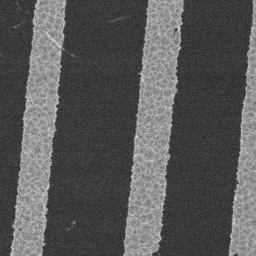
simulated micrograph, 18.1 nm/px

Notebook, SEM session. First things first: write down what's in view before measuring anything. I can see one or a few lines or trenches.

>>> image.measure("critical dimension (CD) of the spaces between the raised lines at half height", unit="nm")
1410